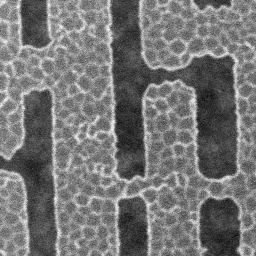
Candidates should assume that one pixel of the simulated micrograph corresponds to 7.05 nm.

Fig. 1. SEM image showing one or a few lines or trenches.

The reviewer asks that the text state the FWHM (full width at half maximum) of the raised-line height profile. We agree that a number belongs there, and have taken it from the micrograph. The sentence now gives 386 nm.